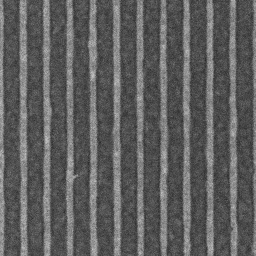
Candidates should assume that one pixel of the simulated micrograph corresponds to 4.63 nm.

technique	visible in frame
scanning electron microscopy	parallel lines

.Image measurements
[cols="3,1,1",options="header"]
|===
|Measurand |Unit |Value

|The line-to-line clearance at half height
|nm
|82.2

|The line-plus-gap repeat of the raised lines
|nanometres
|108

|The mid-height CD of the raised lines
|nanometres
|26.1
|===